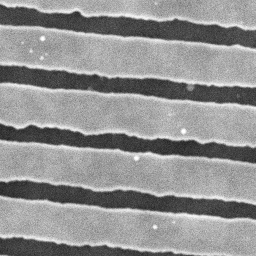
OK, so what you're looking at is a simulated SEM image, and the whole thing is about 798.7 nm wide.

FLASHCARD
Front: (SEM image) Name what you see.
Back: lines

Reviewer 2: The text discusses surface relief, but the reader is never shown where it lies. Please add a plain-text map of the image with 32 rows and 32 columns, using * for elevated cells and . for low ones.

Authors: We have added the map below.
********************************
.....****.**********************
...................**..*********
*****.........................**
***************.................
**************************......
********************************
********************************
.....***************************
.............*******************
***......................*******
************....................
***********************.........
********************************
********************************
********************************
..........**********************
......................*.********
************....................
***********************.........
********************************
********************************
********************************
...........*********************
......................**********
*********......................*
********************............
********************************
********************************
********************************
........************************
...................*************